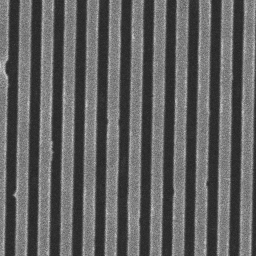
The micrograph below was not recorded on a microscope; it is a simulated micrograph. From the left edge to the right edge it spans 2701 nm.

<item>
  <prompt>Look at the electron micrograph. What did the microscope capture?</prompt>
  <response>parallel lines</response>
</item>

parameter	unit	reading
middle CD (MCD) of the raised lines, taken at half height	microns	0.128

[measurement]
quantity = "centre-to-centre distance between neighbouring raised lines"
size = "0.237 micrometres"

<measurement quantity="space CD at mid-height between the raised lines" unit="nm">108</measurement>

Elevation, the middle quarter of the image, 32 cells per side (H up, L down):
HHHLLHHHLLLHHHLLLHHHLLHHHLLLHHHL
HHHLLHHHLLLHHHLLLHHHLLHHHLLLHHHL
HHHLLHHHLLLHHHLLLHHHLLHHHLLLHHHL
HHHLLHHHLLLHHHLLLHHHLLHHHLLLHHHL
HHHLLHHHLLLHHHLLLHHHLLHHHLLLHHHL
HHHLLHHHLLLHHHLLLHHHLLHHHLLLHHHL
HHHLLHHHLLLHHHLLLHHHLLHHHLLLHHHL
HHHLLHHHLLLHHHLLLHHHLLHHHLLLHHHL
HHHLLHHHLLLHHHLLLHHHLLHHHLLLHHHL
HHHLLHHHLLLHHHLLHHHHLLHHHLLLHHHL
HHHLLHHHLLLHHHLLHHHHLLHHHLLLHHHL
HHLLLHHHLLLHHHLLHHHLLLHHHLLLHHHL
HHLLLHHHLLLHHHLLHHHLLLHHHLLLHHHL
HHLLLHHHLLLHHHLLHHHLLLHHHLLLHHHL
HHLLLHHHLLLHHLLLHHHLLLHHHLLLHHHL
HHLLLHHHLLLHHHLLHHHLLLHHHLLLHHHL
HHLLLHHHLLLHHHLLHHHLLLHHHLLLHHLL
HHLLLHHHLLLHHHLLHHHLLLHHHLLLHHLL
HHLLLHHHLLLHHHLLHHHLLLHHHLLLHHHL
HHLLLHHHLLLHHHLLHHHLLLHHHLLLHHHL
HHLLLHHHLLLHHLLLHHHLLLHHHLLLHHLL
HHLLLHHHLLLHHHLLHHHLLLHHHLLLHHLL
HHLLLHHHLLLHHHLLHHHLLLHHHLLLHHLL
HHLLLHHHLLLHHHLLHHHLLLHHHLLLHHLL
HHLLLHHHLLLHHHLLHHHLLLHHHLLHHHLL
HHLLLHHHLLLHHHLLHHHLLLHHHLLHHHLL
HHLLLHHHLLLHHHLLHHHLLLHHHLLHHHLL
HHLLLHHHLLLHHLLLHHHLLLHHHLLHHHLL
HHLLLHHHLLLHHLLLHHHLLLHHHLLHHHLL
HHLLLHHHLLLHHLLLHHHLLLHHHLLHHHLL
HHLLLHHHLLLHHLLLHHHLLLHHHLLHHHLL
HHLLLHHHLLLHHLLLHHHLLLHHHLLLHHLL